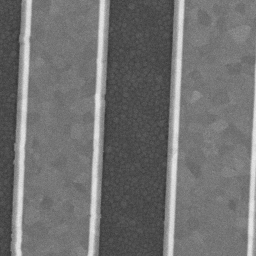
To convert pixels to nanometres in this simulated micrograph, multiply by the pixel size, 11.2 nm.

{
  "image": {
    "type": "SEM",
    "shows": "one or a few lines or trenches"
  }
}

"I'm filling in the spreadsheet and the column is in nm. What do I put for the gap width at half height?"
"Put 892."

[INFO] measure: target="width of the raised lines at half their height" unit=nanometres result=828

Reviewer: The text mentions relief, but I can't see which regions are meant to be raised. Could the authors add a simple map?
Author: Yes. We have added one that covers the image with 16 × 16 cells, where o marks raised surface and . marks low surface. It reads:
..oooo.....ooooo
..oooo.....ooooo
..oooo.....ooooo
..oooo.....ooooo
..oooo.....ooooo
..oooo.....ooooo
..oooo.....ooooo
.ooooo.....ooooo
.ooooo.....ooooo
.ooooo.....ooooo
.ooooo.....ooooo
.ooooo.....ooooo
.ooooo.....ooooo
.ooooo.....ooooo
.ooooo.....ooooo
.ooooo.....ooooo